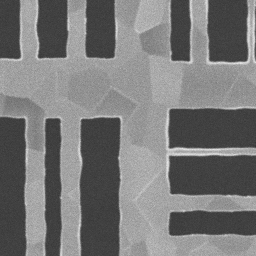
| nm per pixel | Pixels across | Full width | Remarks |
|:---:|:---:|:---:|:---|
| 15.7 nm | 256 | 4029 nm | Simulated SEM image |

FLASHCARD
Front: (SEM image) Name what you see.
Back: groups of lines, slits or small figures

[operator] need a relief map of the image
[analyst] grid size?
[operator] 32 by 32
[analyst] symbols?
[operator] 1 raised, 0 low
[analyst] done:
00011000011000111111100011000001
00011000011000111111100011000001
00011000011000111111100011000001
00011000011000011111100011000001
00011000011000011111100011000001
00011000111000111111100011000001
00011000111000111111100011000000
11111111111111111111110011000001
11111111111111111111111111111111
11111111111111111111111111111111
11111111111111111111111111111111
11111111111111111111111111111111
11111111111111111111111111111111
11111111111111111111111111011100
11111111111111111111100000000000
00011100110000011111100000000000
00011100110000011111100000000000
00011100110000011111100000000000
00011100110000011111100000000000
00011100110000011111100000000000
00011100110000011111100000000000
00011100110000011111100000000000
00011100110000011111100000000000
00011100110000011111100000000000
00011100110000011111111101110000
00011100110000011111111111111111
00011100110000011111110000000000
00011100110000011111100000000000
00011100110000011111100000000000
00011100110000011111110111111101
00011100110000011111111111111111
00011100110000011111111111111111